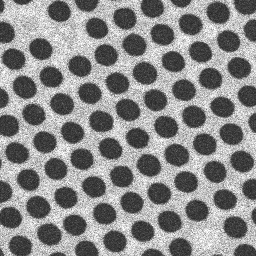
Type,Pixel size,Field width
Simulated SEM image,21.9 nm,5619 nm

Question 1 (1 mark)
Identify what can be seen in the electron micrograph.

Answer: a regular array of holes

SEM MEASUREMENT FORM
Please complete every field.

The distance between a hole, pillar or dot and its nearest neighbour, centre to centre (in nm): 631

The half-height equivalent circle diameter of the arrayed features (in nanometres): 497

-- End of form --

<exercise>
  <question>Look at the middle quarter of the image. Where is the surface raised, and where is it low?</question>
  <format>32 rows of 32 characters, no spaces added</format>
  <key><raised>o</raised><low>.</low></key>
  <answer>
o......ooo.ooooooo....ooo.....oo
o......oooooooooo......ooo...ooo
oo....oooooo...oo......ooooooooo
ooooooooooo.....oo.....ooooooooo
oooooooooo......ooo....ooooo....
oooo....ooo.....ooooooooooo.....
oooo.....oo.....ooooo..oooo.....
oooo.....ooo...ooooo.....oo.....
..oo.....ooooooooooo......oo....
..ooo...ooooo.....oo......oooooo
...oooooooooo......o......ooooo.
..ooooooooooo......ooo..oooooo..
.oooooo....oo......oooooooooo...
oooooo......oo.....oooo....ooo..
o.oooo......ooooooooooo.....oo..
....ooo.....oooooooooo......ooo.
.....oo....ooooo....ooo......ooo
.....ooooooooooo.....oo.....oooo
.....oooooo.ooo......oooo.oooooo
o...ooooo.....oo.....ooooooooooo
ooooooooo.....ooo....ooooo....oo
ooo...ooo......oooooooooo......o
oo.....oo.....ooooooo.ooo......o
oo.....ooo....ooooo....oo......o
oo.....ooooooooooo......oo.....o
.o.....oooooo..ooo......oooo.ooo
.ooooooooooo.....oo.....oooooooo
.oooooooooo......oo.....oooo....
oooooo...ooo.....ooooooooooo....
ooooo.....oo.....ooooooooooo....
oooo......ooo...oooooo....oo....
..ooo.....ooooooooooo......oo...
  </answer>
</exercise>